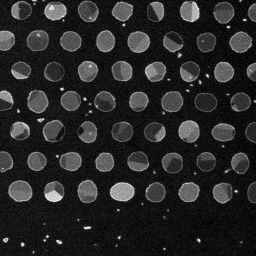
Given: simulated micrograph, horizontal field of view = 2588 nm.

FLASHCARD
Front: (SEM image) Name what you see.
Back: a regular array of raised bodies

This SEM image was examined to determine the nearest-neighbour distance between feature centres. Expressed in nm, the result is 339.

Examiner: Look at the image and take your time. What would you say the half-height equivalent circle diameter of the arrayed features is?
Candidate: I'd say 19.7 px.